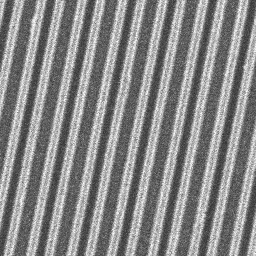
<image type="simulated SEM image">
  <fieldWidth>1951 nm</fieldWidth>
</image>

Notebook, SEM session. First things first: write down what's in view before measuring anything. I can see parallel lines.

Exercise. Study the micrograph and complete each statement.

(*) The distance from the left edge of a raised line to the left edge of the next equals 152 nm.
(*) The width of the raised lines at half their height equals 66.3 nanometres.